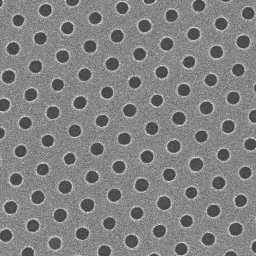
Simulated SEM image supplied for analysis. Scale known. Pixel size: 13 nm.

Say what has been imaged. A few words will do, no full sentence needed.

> a regular array of holes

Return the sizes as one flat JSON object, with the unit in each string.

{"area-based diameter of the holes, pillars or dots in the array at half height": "0.165 micrometres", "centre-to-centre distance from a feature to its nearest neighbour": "28.4 px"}